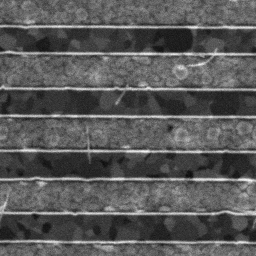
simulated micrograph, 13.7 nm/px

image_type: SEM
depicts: one or a few lines or trenches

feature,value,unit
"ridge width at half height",391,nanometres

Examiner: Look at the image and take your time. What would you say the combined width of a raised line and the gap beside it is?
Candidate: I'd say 853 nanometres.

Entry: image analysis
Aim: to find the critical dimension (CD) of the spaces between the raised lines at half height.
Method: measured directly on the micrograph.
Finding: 464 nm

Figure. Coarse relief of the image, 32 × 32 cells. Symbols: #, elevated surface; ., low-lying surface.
................................
................................
................................
################################
################################
################################
################################
................................
......................#.........
......................#.........
................................
################################
################################
################################
...###.......###################
................................
................................
................................
................................
################################
################################
################################
..........##...................#
................................
................................
................................
#...............................
################################
################################
################################
................................
................................